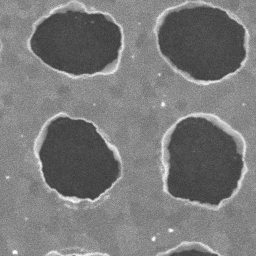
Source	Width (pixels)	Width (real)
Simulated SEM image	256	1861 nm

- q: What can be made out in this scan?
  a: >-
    holes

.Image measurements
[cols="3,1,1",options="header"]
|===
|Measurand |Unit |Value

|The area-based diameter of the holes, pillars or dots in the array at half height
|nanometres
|586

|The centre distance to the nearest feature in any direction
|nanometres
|866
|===